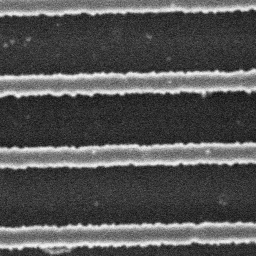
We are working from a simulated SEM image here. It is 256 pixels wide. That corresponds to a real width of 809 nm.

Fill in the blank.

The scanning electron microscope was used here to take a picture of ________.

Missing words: lines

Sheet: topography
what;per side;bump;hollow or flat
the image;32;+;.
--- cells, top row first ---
++++++++++++++++++++++++++++++++
++++++++++++++++.+.......+......
................................
................................
................................
................................
................................
................................
................................
...+++++++++++++++++++++++++++++
++++++++++++++++++++++++++++++++
++++++++++++++++++.+++..........
................................
................................
................................
................................
................................
................................
.....++++.++++++++++++++++++++++
++++++++++++++++++++++++++++++++
++++++++++++++++++++++++...++...
................................
................................
................................
................................
................................
................................
................................
+..+++++++++++++++++++++++++++++
++++++++++++++++++++++++++++++++
++++++++++++++++++++.+++........
................................